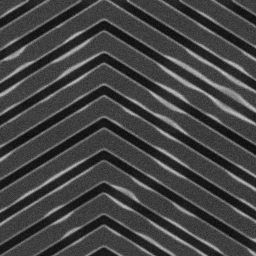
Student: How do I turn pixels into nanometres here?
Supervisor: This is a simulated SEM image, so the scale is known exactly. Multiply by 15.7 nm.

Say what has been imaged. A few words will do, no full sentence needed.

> groups of lines, slits or small figures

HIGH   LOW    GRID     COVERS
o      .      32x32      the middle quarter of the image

oooo.....oo.....oooooooo......oo
oo.....oooooo....ooooooooo......
......ooooooooo....oooooooo.....
....oooooooooooo.....oooooooo...
..oooooooooooooooo....oooooooo..
.oooooooo..ooooooooo.....ooooooo
oooooooo....ooooooooo.....oooooo
oooooo........oooooooo......oooo
oooo.....oo.....oooooooo......oo
ooo....oooooo.....ooooooo......o
o.....ooooooooo....oooooooo.....
....oooooooooooo.....oooooooo...
..ooooooooooooooo.....ooooooooo.
.oooooooooooooooooo.....oooooooo
oooooooo.....oooooooo.....oooooo
oooooo........ooooooooo.....oooo
ooooo....oo.....oooooooo.....ooo
ooo....oooooo....oooooooo.....oo
o.....oooooooo.....oooooooo.....
....oooooooooooo.....oooooooo...
..oooooooooooooooo....ooooooooo.
.oooooooooooooooooo.....oooooooo
oooooooo....ooooooooo.....oooooo
oooooo........oooooooo.....ooooo
oooo.....oo....ooooooooo.....ooo
oo.....oooooo....oooooooo......o
o.....oooooooo.....oooooooo.....
.....ooooooooooo....oooooooo....
...oooooooooooooo.....oooooooo..
.ooooooooooooooooo.....ooooooooo
oooooooo....oooooooo.....ooooooo
oooooo.........ooooooo.....ooooo